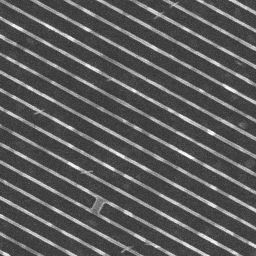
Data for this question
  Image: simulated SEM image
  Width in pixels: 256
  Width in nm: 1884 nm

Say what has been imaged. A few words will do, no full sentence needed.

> parallel lines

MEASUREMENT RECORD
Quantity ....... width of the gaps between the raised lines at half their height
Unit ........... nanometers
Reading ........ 97.8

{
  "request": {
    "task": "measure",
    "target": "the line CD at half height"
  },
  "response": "18.6 nm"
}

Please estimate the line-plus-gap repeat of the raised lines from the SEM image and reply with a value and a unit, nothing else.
0.116 microns